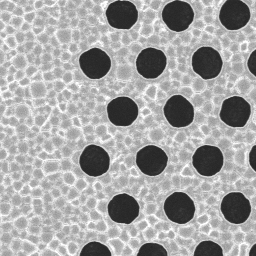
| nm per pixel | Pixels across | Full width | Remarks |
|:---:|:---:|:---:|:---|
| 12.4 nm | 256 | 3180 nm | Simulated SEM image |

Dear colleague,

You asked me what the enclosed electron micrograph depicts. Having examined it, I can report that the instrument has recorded a regular array of holes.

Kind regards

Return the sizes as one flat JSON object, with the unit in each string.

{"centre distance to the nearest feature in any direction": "691 nanometres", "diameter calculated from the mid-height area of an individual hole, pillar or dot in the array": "31.1 pixels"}